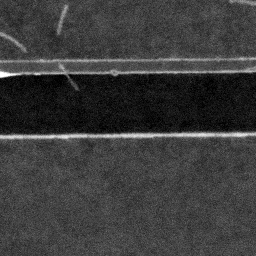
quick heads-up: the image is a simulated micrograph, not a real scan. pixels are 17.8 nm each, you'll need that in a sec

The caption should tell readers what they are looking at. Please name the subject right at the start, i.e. lines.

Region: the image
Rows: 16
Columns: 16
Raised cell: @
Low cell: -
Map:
@@@@@@@@@@@@@@@@
@@@@@@@@@@@@@@@@
@@@@@@@@@@@@@@@@
@@@@@@@@@@@@@@@@
@@@@@@@@@@@-----
----------------
----------------
----------------
--------------@@
@@@@@@@@@@@@@@@@
@@@@@@@@@@@@@@@@
@@@@@@@@@@@@@@@@
@@@@@@@@@@@@@@@@
@@@@@@@@@@@@@@@@
@@@@@@@@@@@@@@@@
@@@@@@@@@@@@@@@@